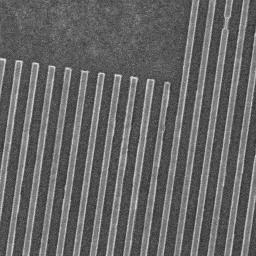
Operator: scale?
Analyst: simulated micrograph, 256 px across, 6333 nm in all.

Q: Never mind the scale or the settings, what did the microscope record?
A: parallel lines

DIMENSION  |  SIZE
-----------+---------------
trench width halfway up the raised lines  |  0.26 µm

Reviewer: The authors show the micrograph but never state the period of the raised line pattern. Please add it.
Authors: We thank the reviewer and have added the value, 413 nm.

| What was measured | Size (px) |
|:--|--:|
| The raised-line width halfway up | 5.7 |